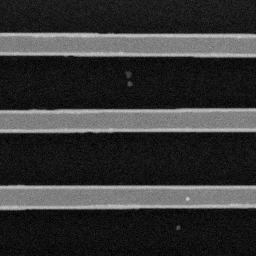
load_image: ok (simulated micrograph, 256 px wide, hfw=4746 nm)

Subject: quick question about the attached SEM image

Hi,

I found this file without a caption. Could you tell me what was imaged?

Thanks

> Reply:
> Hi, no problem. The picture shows lines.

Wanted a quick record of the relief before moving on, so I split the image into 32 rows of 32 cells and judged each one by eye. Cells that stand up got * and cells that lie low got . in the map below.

................................
................................
................................
................................
********************************
********************************
********************************
................................
................................
................................
................................
................................
................................
................................
********************************
********************************
*******.........................
................................
................................
................................
................................
................................
................................
********************************
********************************
********************************
................................
................................
................................
................................
................................
................................